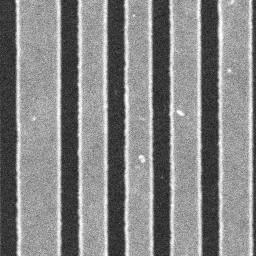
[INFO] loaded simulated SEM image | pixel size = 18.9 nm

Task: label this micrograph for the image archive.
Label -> lines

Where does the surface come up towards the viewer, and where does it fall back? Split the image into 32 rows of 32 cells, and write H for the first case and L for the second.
LLHHHHHLLLHHHLLLHHHLLHHHHLLHHHHL
LLHHHHHHLLHHHLLLHHHLLHHHHLLHHHHL
LLHHHHHHLLHHHLLLHHHLLHHHHLLHHHHL
LLHHHHHLLLHHHLLLHHHLLHHHHLLHHHHH
LLHHHHHLLLHHHLLLHHHLLHHHHLLHHHHL
LLHHHHHHLLHHHLLLHHHLLHHHHLLHHHHL
LLHHHHHHLLHHHLLLHHHLLHHHHLLHHHHL
LLHHHHHHLLHHHLLLHHHLLHHHHLLHHHHL
LLHHHHHHLLHHHLLLHHHLLHHHHLLHHHHL
LLHHHHHHLLHHHLLLHHHLLHHHHLLHHHHL
LLHHHHHHLLHHHLLLHHHLLHHHHLLHHHHL
LLHHHHHHLLHHHLLLHHHLLHHHHLLHHHHH
LLHHHHHHLLHHHLLLHHHLLHHHHLLHHHHH
LLHHHHHHLLHHHLLLHHHLLHHHHLLHHHHH
LLHHHHHHLLHHHLLLHHHLLHHHHLLHHHHH
LLHHHHHHLLHHHLLLHHHLLHHHHLLHHHHH
LLHHHHHHLLHHHLLLHHHLLHHHHLLHHHHH
LLHHHHHHLLHHHLLLHHHLLHHHHLLHHHHH
LLHHHHHHLLHHHLLLHHHLLHHHHLLHHHHH
LLHHHHHHLLHHHLLLHHHLLHHHHLLHHHHH
LLHHHHHHLLHHHLLLHHHLLHHHHLLHHHHH
LLHHHHHHLLHHHLLLHHHLLHHHHLLLHHHH
LLHHHHHHLLHHHLLLHHHLLHHHHLLHHHHH
LLHHHHHHLLHHHLLLHHHLLHHHHLLHHHHH
LLHHHHHHLLHHHLLLHHHLLHHHHLLLHHHH
LLHHHHHHLLHHHLLLHHHLLHHHHLLLHHHH
LLHHHHHHLLHHHLLLHHHLLHHHHLLHHHHH
LLHHHHHHLLHHHLLLHHHLLHHHHLLLHHHH
LLHHHHHHLLHHHLLLHHHLLHHHHLLLHHHH
LLHHHHHHLLHHHLLLHHHLLHHHHLLLHHHH
LLHHHHHHLLHHHLLLHHHLLHHHHLLHHHHH
LLHHHHHHLLHHHLLLHHHLLHHHHLLLHHHH